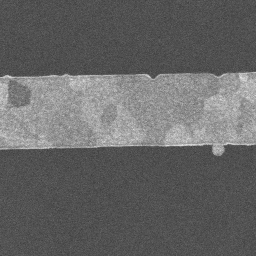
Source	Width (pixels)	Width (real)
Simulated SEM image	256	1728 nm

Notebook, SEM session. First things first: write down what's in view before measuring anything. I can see one or a few lines or trenches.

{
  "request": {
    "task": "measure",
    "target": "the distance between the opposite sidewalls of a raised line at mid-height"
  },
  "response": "483 nm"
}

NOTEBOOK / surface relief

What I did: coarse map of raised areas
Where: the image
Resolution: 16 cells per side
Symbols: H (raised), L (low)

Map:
LLLLLLLLLLLLLLLL
LLLLLLLLLLLLLLLL
LLLLLLLLLLLLLLLL
LLLLLLLLLLLLLLLL
LLLLLLLLLLLLLLLL
HHHHHHHHHHHHHHHH
HHHHHHHHHHHHHHHH
HHHHHHHHHHHHHHHH
HHHHHHHHHHHHHHHH
LLLLLLLLLLLLLLLL
LLLLLLLLLLLLLLLL
LLLLLLLLLLLLLLLL
LLLLLLLLLLLLLLLL
LLLLLLLLLLLLLLLL
LLLLLLLLLLLLLLLL
LLLLLLLLLLLLLLLL